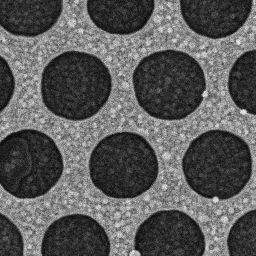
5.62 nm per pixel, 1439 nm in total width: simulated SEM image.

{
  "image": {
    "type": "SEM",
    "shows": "holes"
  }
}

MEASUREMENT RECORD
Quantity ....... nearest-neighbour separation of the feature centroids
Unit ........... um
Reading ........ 0.523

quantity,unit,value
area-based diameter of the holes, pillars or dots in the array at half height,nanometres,395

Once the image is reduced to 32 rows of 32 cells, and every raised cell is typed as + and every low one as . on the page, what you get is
........+++........++++.........
........+++........++++........+
.......++++........++++........+
......++++++......++++++......++
+++..++++++++++++++++++++....+++
++++++++++++++++++++++++++++++++
++++++++..++++++++++...++++++++.
.+++++.......+++++......++++++..
.+++++.......++++........++++...
..+++.........+++.........+++...
..+++.........+++.........++....
..+++.........+++........++++...
.++++........++++........++++...
.+++++.......+++++.......+++++..
+++++++.....+++++++....+++++++++
++++++++++++++++++++++++++++++++
++...++++++++++.++++++++++...+++
.......++++++.....++++++......++
.......+++++.......++++........+
........+++.........+++........+
........+++.........+++.........
........+++.........+++........+
.......++++........++++........+
......++++++.......+++++......++
++...++++++++....++++++++....+++
++++++++++++++++++++++++++++++++
++++++++++++++++++++...++++++++.
.++++++.....++++++......++++++..
..++++.......++++........++++...
...++........++++........+++....
...++.........+++.........++....
...++.........+++.........+++...